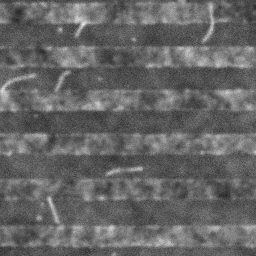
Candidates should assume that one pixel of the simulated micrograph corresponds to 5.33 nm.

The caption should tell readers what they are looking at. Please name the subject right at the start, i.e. lines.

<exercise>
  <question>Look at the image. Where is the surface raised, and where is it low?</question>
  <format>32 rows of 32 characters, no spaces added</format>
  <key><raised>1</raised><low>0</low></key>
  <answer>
00110100000111000111011110100000
11111111111111111111111111111111
11111111111111111111111111111111
00000000000000000000000000000000
00000000000000000000000000000000
00000000000000000000000000000000
11111111111111111111111111111111
11111111111111111111111111111111
00000000000000000000000000000000
00000000000000000000000000000000
00000000000000000000000000000000
11111111111111111111111111111111
11111111111111111111111111111111
11111111111111111111111111111111
00000000000000000000000000000000
00000000000000000000000000000000
00000000000000000000000000000000
11111111111111111111111111111111
11111111111111111111111111111111
00000000000000000000000000000000
00000000000000000000000000000000
00000000000000000000000000000000
00000000000000000011000000000000
11111111111111111111111111111111
11111111111111111111111111111111
00000000000000000000000000000000
00000000000000000000000000000000
00000000000000000000000000000000
11111111111111111111111111111111
11111111111111111111111111111111
11111111111111111111111111111111
00000000000000000000000000000000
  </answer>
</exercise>